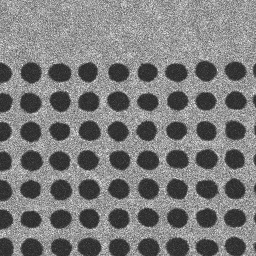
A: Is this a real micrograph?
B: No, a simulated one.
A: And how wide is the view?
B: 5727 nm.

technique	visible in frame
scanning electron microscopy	a regular array of holes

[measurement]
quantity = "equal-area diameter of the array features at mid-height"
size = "461 nm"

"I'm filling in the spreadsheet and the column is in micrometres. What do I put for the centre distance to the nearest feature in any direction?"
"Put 0.638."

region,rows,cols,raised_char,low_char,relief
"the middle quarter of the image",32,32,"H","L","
LHHHLLLLHHHHLLLHHHHLLLLHHHLLLLHH
LLHHLLLLLHHLLLLLHHLLLLLLHLLLLLLH
LLHHLLLLLHHLLLLLHHLLLLLLHLLLLLLH
LLHHLLLLHHHLLLLLHHHLLLLHHHLLLLLH
HHHHHLLHHHHHHLLHHHHHLHHHHHHHLHHH
HHHHHHHHHHHHHHHHHHHHHHHHHHHHHHHH
HHHHHHHHHHHHHHHHHHHHHHHHHHHHHHHH
LHHHHLLLHHHHLLLHHHHLLLHHHHHLLLHH
LLHHLLLLLHHLLLLLHHHLLLLHHHLLLLLH
LLHHLLLLLHHLLLLLLHLLLLLLHHLLLLLH
LHHHLLLLLHHLLLLLHHHLLLLLHHLLLLLH
LHHHHLLLHHHHLLLHHHHHLLHHHHHHLHHH
HHHHHHHHHHHHHHHHHHHHHHHHHHHHHHHH
HHHHHHHHHHHHHHHHHHHHHHHHHHHHHHHH
HHHHHLLHHHHHHLHHHHHLLLHHHHHLLHHH
LHHHLLLLLHHLLLLHHHLLLLLHHHLLLLLH
LLHHLLLLLHHLLLLLHHLLLLLHHLLLLLLH
LHHHLLLLLHHLLLLLHHLLLLLHHHLLLLLH
LHHHLLLLLHHHLLLLHHHLLLLHHHHLLLHH
HHHHHHHHHHHHHLHHHHHHHHHHHHHHHHHH
HHHHHHHHHHHHHHHHHHHHHHHHHHHHHHHH
HHHHHHHHHHHHHHHHHHHHHHHHHHHLLHHH
LHHHLLLLHHHHLLLLHHHLLLLHHHLLLLLH
LHHLLLLLLHHLLLLLLHLLLLLLHHLLLLLH
LLHLLLLLLHHLLLLLHHLLLLLLHHLLLLLH
LHHHLLLLHHHHLLLLHHHLLLLHHHHLLLLH
HHHHHLLHHHHHHLLHHHHHHHHHHHHHHHHH
HHHHHHHHHHHHHHHHHHHHHHHHHHHHHHHH
HHHHHHHHHHHHHHHHHHHHLHHHHHHHHHHH
LHHHLLLLHHHHLLLHHHHLLLLHHHLLLLHH
LLHHLLLLLHHLLLLLHHLLLLLLHHLLLLLH
LLHLLLLLLHHLLLLLHHLLLLLLHLLLLLLH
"